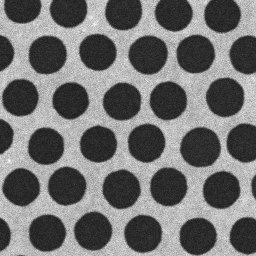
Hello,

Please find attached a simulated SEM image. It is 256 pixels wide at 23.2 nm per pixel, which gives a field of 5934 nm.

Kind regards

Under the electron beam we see a regular array of holes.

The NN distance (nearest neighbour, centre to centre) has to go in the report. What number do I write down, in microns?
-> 1.1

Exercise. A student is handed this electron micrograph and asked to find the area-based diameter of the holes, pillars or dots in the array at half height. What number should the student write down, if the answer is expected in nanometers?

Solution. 890